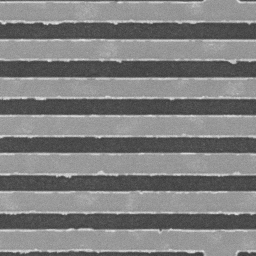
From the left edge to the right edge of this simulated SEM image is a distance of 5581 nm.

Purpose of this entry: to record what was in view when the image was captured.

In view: parallel lines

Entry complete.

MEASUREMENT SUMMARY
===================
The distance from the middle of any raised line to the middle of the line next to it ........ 0.83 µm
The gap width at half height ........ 0.362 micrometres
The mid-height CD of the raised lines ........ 21.5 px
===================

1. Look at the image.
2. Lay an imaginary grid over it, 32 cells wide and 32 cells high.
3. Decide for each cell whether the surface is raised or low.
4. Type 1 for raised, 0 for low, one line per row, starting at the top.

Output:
11111111111111111111111111111111
11111111111111111111111111111111
11111111111111111111111111111111
00000000000000000000000000000000
00000000000000000000000000000000
11111111111111111111111111111111
11111111111111111111111111111111
11111111111111111111011111111111
00000000000000000000000000000000
00000000000000000000000000000000
11111111111111111111111111111111
11111111111111111111111111111111
00000000000000000000000000000000
00000000000000000000000000000000
01000100000100010010000110001110
11111111111111111111111111111111
11111111111111111111111111111111
00000000000000000000000000000000
00000000000000000000000000000000
11111111111111111111111111111111
11111111111111111111111111111111
11111111111111111111111111111111
00000000000000000000000000000000
00000000000000000000000000000000
11111111111111111111111111111111
11111111111111111111111111111111
11111111111111111111111111111111
00000000000000000000000000000000
00000000000000000000000000000000
11111111111111111111111111111111
11111111111111111111111111111111
01110000000010000010000111111100